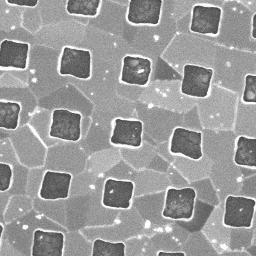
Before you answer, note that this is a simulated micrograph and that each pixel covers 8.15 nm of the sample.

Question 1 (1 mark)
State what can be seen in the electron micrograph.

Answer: a regular array of holes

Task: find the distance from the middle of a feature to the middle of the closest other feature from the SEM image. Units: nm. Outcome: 498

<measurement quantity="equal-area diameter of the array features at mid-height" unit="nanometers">256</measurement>